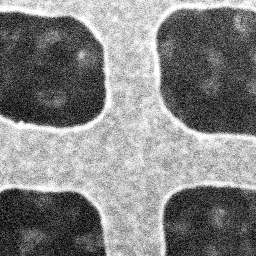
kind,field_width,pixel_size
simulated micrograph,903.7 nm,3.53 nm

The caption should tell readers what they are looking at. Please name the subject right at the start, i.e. holes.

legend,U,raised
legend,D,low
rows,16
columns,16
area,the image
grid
UUUUUUUUUUUDDDDU
DDDDDUUUUUDDDDDD
DDDDDDUUUUDDDDDD
DDDDDDDUUUDDDDDD
DDDDDDDUUUDDDDDD
DDDDDDDUUUDDDDDD
DDDDDDDUUUDDDDDD
DDDDDDUUUUUDDDDD
UUUUUUUUUUUUUUUD
UUUUUUUUUUUUUUUU
UUUUUUUUUUUUUUUU
UUUUUUUUUUUUUUUU
DDDDDDUUUUDDDDDD
DDDDDDUUUUDDDDDD
DDDDDDDUUUDDDDDD
DDDDDDDUUUDDDDDD